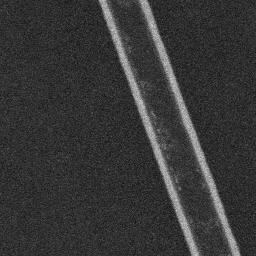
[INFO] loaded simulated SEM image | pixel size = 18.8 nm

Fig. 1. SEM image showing one or a few lines or trenches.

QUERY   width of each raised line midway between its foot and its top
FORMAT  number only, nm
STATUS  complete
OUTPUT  753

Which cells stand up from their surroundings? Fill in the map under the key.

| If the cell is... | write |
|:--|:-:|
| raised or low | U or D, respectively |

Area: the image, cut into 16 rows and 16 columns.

DDDDDDDUUDDDDDDD
DDDDDDDUUUDDDDDD
DDDDDDDUUUDDDDDD
DDDDDDDDUUDDDDDD
DDDDDDDDUUUDDDDD
DDDDDDDDUUUDDDDD
DDDDDDDDDUUDDDDD
DDDDDDDDDUUUDDDD
DDDDDDDDDUUUDDDD
DDDDDDDDDDUUDDDD
DDDDDDDDDDUUUDDD
DDDDDDDDDDDUUDDD
DDDDDDDDDDDUUUDD
DDDDDDDDDDDUUUDD
DDDDDDDDDDDDUUDD
DDDDDDDDDDDDUUUD